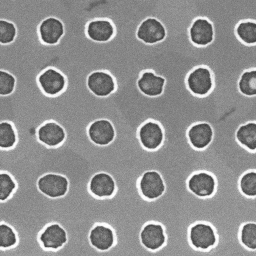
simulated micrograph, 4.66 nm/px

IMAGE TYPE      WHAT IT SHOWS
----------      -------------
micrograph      a regular array of holes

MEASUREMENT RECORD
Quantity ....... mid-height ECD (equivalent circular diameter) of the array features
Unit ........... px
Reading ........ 24.9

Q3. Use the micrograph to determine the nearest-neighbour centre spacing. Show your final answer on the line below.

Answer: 230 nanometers